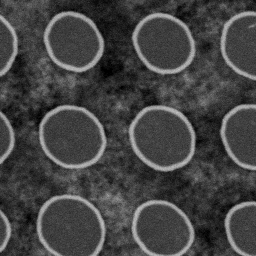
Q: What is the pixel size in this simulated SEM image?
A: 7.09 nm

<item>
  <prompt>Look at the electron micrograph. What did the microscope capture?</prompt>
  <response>raised bodies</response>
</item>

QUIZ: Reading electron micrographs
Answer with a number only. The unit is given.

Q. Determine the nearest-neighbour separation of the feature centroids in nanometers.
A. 639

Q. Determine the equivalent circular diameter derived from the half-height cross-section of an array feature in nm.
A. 425